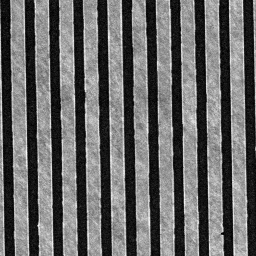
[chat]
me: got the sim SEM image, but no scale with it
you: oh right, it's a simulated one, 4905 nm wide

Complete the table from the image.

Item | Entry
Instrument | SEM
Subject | parallel lines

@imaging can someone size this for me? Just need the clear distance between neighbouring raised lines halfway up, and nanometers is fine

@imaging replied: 216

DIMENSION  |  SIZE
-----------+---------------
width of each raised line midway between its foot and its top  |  252 nm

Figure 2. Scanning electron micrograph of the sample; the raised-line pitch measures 466 nanometers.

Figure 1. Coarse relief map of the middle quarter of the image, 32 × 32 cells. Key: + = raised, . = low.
++...+++...+++...++++...+++...++
+++..+++...+++....+++...+++...++
+++..+++...+++....+++...+++...++
++...+++...++++...+++...+++...++
++...+++...++++...+++...+++...++
++...+++...++++...+++...+++...++
++...+++....+++...+++...+++...++
++...+++....+++...+++...+++...++
++...+++....+++...+++...+++...++
++...++++...+++...+++...+++...++
++...++++...+++...+++...+++...++
++....+++...+++...+++...+++...++
++....+++...+++...+++...+++...++
+++...+++...+++...+++...+++...++
+++...+++...+++...+++...+++...++
+++...+++...+++...+++...+++...++
+++...+++...+++...+++...+++...++
+++...+++...+++...+++...+++...++
+++...+++...+++...+++...+++...++
+++...+++...+++...+++...+++...++
+++...+++...+++...+++...+++...++
+++...+++...+++...+++...+++...++
+++...+++...+++...+++...+++...++
+++...+++...+++...+++...+++...++
+++...+++...+++...+++...+++...++
+++...+++...+++...+++...+++...++
+++...+++...+++...+++...+++...++
+++...+++...+++...+++...+++...++
+++...+++...+++...+++...+++...++
+++...+++...+++...+++...+++...++
+++...+++...+++...+++...+++...++
+++...+++...+++...+++...+++...++